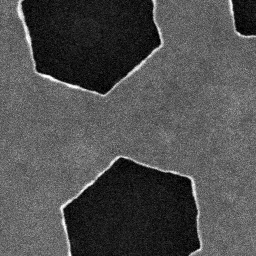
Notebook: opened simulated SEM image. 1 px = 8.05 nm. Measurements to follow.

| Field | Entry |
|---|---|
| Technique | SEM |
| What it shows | holes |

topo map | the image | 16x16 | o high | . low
o.........ooooo.
oo........ooooo.
oo........oooooo
oo.......ooooooo
ooo.....oooooooo
ooooo..ooooooooo
oooooooooooooooo
oooooooooooooooo
oooooooooooooooo
oooooooooooooooo
ooooooo..ooooooo
oooooo......oooo
ooooo.......oooo
oooo........oooo
oooo........oooo
oooo........oooo